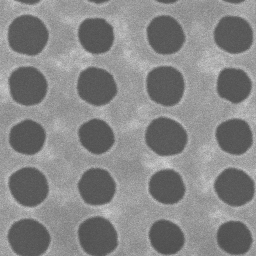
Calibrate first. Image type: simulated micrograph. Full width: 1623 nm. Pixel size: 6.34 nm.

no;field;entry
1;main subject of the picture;a regular array of holes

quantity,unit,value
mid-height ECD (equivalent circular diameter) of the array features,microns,0.246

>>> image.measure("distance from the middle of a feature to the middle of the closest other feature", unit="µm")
0.32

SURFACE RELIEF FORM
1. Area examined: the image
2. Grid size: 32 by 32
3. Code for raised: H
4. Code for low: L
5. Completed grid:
HHHLHHHHHHHHHHHHHHHHLHHHHHHHHLHH
HHHHHHHHHHHHHHHHHHHHHHHHHHHHHHHH
HHLLLHHHHHHLLHHHHHHLLLHHHHHLLLLH
HLLLLLHHHHLLLLHHHHLLLLLHHHHLLLLH
HLLLLLHHHHLLLLHHHHLLLLLHHHHLLLLL
HLLLLLHHHHLLLLHHHHHLLLLHHHHLLLLL
HHLLLHHHHHHLLHHHHHHLLLHHHHHHLLLH
HHHHHHHHHHHHHHHHHHHHHHHHHHHHHHHH
HHLLLHHHHHHLHHHHHHHLLLHHHHHHLLHH
HLLLLHHHHHLLLLHHHHLLLLLHHHHLLLLH
HLLLLLHHHHLLLLLHHHLLLLLHHHHLLLLL
HLLLLLHHHHLLLLLHHHLLLLLHHHHLLLLH
HHLLLHHHHHLLLLHHHHHLLLLHHHHHLLLH
HHHHHHHHHHHHHHHHHHHHHHHHHHHHHHHH
HHHHHHHHHHHHHHHHHHHHHHHHHHHHHHHH
HHLLLHHHHHLLLHHHHHHLLLHHHHHLLLLH
HLLLLLHHHHLLLLHHHHLLLLLHHHHLLLLL
HLLLLLHHHHLLLLHHHHLLLLLHHHHLLLLL
HHLLLHHHHHHLLLHHHHHLLLLHHHHHLLLH
HHHHHHHHHHHHHHHHHHHHLHHHHHHHHHHH
HHHHHHHHHHHHHHHHHHHHHHHHHHHHHHHH
HHLLLHHHHHHLLLHHHHHHLLHHHHHHLLLH
HLLLLLHHHHLLLLHHHHHLLLLHHHHLLLLL
HLLLLLHHHHLLLLHHHHHLLLLHHHHLLLLL
HHLLLLHHHHLLLLHHHHHLLLLHHHHLLLLL
HHLLLHHHHHHLLHHHHHHHLLHHHHHHLLLH
HHHHHHHHHHHHHHHHHHHHHHHHHHHHHHHH
HHLLHHHHHHHLLLHHHHHHLHHHHHHHHHHH
HLLLLLHHHHLLLLHHHHHLLLLHHHHLLLLH
HLLLLLHHHHLLLLLHHHHLLLLHHHHLLLLL
HLLLLLHHHHLLLLLHHHHLLLLHHHHLLLLL
HHLLLLHHHHHLLLHHHHHHLLHHHHHHLLLH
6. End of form